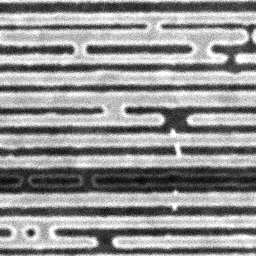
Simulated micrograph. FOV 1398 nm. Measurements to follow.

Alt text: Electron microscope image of parallel lines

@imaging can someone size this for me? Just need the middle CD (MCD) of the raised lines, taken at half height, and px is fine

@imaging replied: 8.86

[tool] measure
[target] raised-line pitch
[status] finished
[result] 111 nm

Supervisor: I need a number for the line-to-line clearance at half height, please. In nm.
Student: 64.1